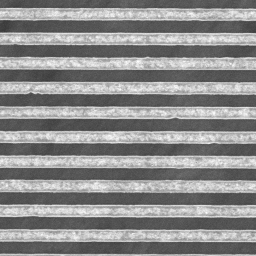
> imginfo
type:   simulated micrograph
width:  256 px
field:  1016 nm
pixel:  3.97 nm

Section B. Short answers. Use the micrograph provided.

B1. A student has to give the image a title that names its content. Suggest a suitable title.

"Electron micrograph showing parallel lines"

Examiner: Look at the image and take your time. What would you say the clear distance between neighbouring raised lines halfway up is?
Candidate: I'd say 54.1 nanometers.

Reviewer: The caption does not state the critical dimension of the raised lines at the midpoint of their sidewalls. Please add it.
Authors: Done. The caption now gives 11.6 px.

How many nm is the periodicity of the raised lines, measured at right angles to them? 97.8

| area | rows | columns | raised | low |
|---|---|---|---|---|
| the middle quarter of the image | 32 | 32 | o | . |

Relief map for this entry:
oooooooooooooooooooooooooooooooo
................................
................................
................................
................................
oooooooooooooooooooooooooooooooo
oooooooooooooooooooooooooooooooo
................................
................................
................................
................................
oooooooooooooooooooooooooooooooo
oooooooooooooooooooooooooooooooo
..........................o.....
................................
................................
................................
oooooooooooooooooooooooooooooooo
oooooooooooooo.oooooooo.oooo.ooo
oooooooo.ooooooooooooooooooooooo
................................
................................
................................
oooooooooooooooooooooooooooooooo
oooooooooooooooooooooooooooooooo
oooooooooooooooooooooooooooooooo
................................
................................
................................
oooooooooooooooooooooooooooooooo
oooooooooooooooooooooo.ooooooo..
oooooooooooooooooooooooooooooooo